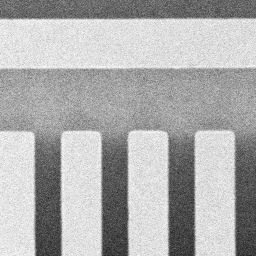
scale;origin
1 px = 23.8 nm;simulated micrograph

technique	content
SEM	groups of lines, slits or small figures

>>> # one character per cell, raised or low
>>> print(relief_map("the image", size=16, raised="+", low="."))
................
++++++++++++++++
++++++++++++++++
++++++++++++++++
................
................
................
................
++..++..++..++..
++..++..++..+++.
++..++..++..+++.
++..++..++..+++.
++..++..++..+++.
++..++..++..+++.
++..++..++..+++.
++..++..++..+++.